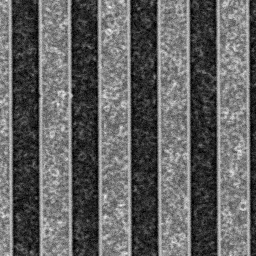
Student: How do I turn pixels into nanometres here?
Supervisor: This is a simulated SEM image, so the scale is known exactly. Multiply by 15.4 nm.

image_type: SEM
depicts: parallel lines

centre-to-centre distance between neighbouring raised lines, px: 59.3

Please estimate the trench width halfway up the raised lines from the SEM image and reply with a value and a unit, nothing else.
447 nm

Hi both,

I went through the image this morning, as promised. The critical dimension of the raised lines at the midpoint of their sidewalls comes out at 470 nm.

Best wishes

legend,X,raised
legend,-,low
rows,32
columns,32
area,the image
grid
X----XXXX---XXXX----XXXX---XXXX-
X----XXXX---XXXX----XXXX---XXXX-
X----XXXX---XXXX----XXXX---XXXX-
X----XXXX---XXXX----XXXX---XXXX-
X----XXXX---XXXX----XXXX---XXXX-
X----XXXX---XXXX----XXXX---XXXX-
X----XXXX---XXXX----XXXX---XXXX-
X----XXXX---XXXX----XXXX---XXXX-
X----XXXX----XXX----XXXX---XXXX-
X----XXXX----XXX----XXXX---XXXX-
X----XXXX----XXX----XXXX---XXXX-
X----XXXX----XXX----XXXX---XXXX-
X----XXXX----XXX----XXXX---XXXX-
X----XXXX----XXX----XXXX---XXXX-
X----XXXX----XXX----XXXX---XXXX-
X----XXXX----XXX----XXXX---XXXX-
X----XXXX----XXX----XXXX---XXXX-
X----XXXX----XXX----XXXX---XXXX-
X----XXXX----XXX----XXXX---XXXX-
X----XXXX----XXX----XXXX---XXXX-
X----XXXX----XXX----XXXX---XXXX-
X----XXXX----XXX----XXXX---XXXX-
X----XXXX----XXX----XXXX---XXXX-
X----XXXX----XXX----XXXX---XXXX-
X----XXXX----XXX----XXXX---XXXX-
X----XXXX----XXX----XXXX---XXXX-
X----XXXX----XXX----XXXX---XXXX-
X----XXXX----XXX----XXXX---XXXX-
X----XXXX----XXX----XXXX---XXXX-
X----XXXX----XXX----XXXX---XXXX-
X----XXXX----XXX----XXXX---XXXX-
X----XXXX----XXX----XXXX---XXXX-